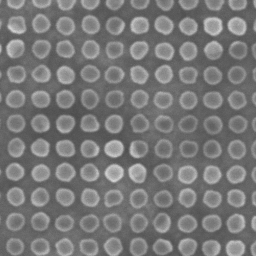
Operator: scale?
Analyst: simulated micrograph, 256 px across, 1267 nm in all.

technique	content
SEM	a regular array of raised bodies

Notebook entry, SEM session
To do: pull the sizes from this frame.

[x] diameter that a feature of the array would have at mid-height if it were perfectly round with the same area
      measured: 84.8 nm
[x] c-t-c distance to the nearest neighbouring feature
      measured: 23.9 pixels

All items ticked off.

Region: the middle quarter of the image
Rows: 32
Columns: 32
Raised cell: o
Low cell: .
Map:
......o..................o......
oo...oooo..ooo...ooo...oooo..ooo
ooo.ooooo.ooooo..oooo..oooo..ooo
ooo..oooo.ooooo..oooo..oooo..ooo
oo.........ooo....oo....oo....oo
................................
................................
oo...ooo...oooo..oooo..ooo....oo
oo...ooo...oooo..oooo..oooo..ooo
oo...ooo...oooo..oooo..oooo..ooo
oo...ooo...ooo....oo....oo....oo
................................
................................
oo...ooo...ooo...ooo...ooo....oo
ooo.oooo...oooo..oooo..oooo..ooo
oo..ooooo..oooo..oooo..oooo..ooo
oo...ooo...ooo...ooo....ooo..ooo
................................
................................
oo...oo.....oo...ooo....oo....o.
oo..oooo..ooooo..oooo..oooo..ooo
ooo.oooo..ooooo..oooo..oooo..ooo
oo...ooo...ooo...ooo...oooo...oo
................................
................................
oo...ooo....oo...oo.....oo......
oo..oooo..ooooo.oooo...oooo..ooo
ooo.oooo...oooo.oooo...oooo..ooo
oo...ooo...ooo...ooo....oo...ooo
..................oo..........oo
................................
o....oo............o..........oo